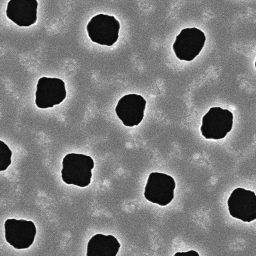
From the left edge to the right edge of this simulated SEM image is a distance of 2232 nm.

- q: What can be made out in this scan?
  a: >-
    a regular array of holes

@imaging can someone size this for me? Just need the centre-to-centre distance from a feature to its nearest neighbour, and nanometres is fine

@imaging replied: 728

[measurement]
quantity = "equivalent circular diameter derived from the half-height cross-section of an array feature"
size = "281 nm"